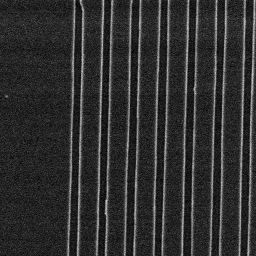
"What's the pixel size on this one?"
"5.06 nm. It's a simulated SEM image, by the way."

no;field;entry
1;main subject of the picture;parallel lines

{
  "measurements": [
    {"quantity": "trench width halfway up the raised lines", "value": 41.1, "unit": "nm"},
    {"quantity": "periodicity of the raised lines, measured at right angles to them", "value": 144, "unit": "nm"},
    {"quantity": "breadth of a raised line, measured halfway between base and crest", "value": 0.101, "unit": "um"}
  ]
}